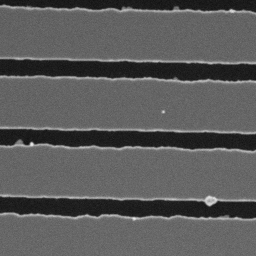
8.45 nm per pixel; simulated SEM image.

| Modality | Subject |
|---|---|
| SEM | lines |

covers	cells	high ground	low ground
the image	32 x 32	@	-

--------------------------------
@@@@@@@@@@@@@@@@@@@@@@@@@@@@@@@@
@@@@@@@@@@@@@@@@@@@@@@@@@@@@@@@@
@@@@@@@@@@@@@@@@@@@@@@@@@@@@@@@@
@@@@@@@@@@@@@@@@@@@@@@@@@@@@@@@@
@@@@@@@@@@@@@@@@@@@@@@@@@@@@@@@@
@@@@@@@@@@@@@@@@@@@@@@@@@@@@@@@@
-----@--@@@@@@@@@@@@@@@@@@@@@@@@
--------------------------------
--------------------------------
@@@@@@@@@@@@@@@@@@@@@@@@@@@@@@@@
@@@@@@@@@@@@@@@@@@@@@@@@@@@@@@@@
@@@@@@@@@@@@@@@@@@@@@@@@@@@@@@@@
@@@@@@@@@@@@@@@@@@@@@@@@@@@@@@@@
@@@@@@@@@@@@@@@@@@@@@@@@@@@@@@@@
@@@@@@@@@@@@@@@@@@@@@@@@@@@@@@@@
---------------------------@@@@@
--------------------------------
@@@@@@@@@@@@@@@@@@@@@@----------
@@@@@@@@@@@@@@@@@@@@@@@@@@@@@@@@
@@@@@@@@@@@@@@@@@@@@@@@@@@@@@@@@
@@@@@@@@@@@@@@@@@@@@@@@@@@@@@@@@
@@@@@@@@@@@@@@@@@@@@@@@@@@@@@@@@
@@@@@@@@@@@@@@@@@@@@@@@@@@@@@@@@
@@@@@@@@@@@@@@@@@@@@@@@@@@@@@@@@
--------------------------@-----
--------------------------------
@@@@@@@@@@@@@@@@@@@@@@@@@@@@@@@@
@@@@@@@@@@@@@@@@@@@@@@@@@@@@@@@@
@@@@@@@@@@@@@@@@@@@@@@@@@@@@@@@@
@@@@@@@@@@@@@@@@@@@@@@@@@@@@@@@@
@@@@@@@@@@@@@@@@@@@@@@@@@@@@@@@@